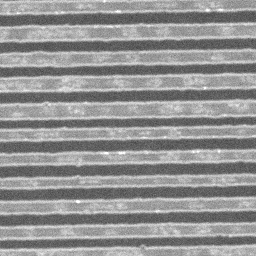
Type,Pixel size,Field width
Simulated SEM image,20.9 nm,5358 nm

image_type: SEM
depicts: parallel lines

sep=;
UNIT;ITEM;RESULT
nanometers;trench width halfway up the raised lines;251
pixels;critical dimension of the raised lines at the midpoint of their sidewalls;13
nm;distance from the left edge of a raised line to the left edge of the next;520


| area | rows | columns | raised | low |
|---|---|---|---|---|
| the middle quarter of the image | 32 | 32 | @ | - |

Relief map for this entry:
-@@@@@@@@@@@@@@@@@@@@@@@@@@@@@@@
@@@@@@@@@@@@@@@@@@@@@@@@@@@@@@@@
@@@@@@@@@@@@@@@@@@@@@@@@@@@@@@@@
--------------------------------
--------------------------------
--------------------------------
--@@@---------@--@@@@@@@@@@@@@@@
@@@@@@@@@@@@@@@@@@@@@@@@@@@@@@@@
@@@@@@@@@@@@@@@@@@@@@@@@@@@@@@@@
@@@@@@@@@@@@@@@@@@@@@@--@@@@@@@@
--------------------------------
--------------------------------
--------------------------------
--@@@-@@@@@@@---@@@@@@@@@@@@@@@@
@@@@@@@@@@@@@@@@@@@@@@@@@@@@@@@@
@@@@@@@@@@@@@@@@@@@@@@@@@@@@@@@@
--------------------------------
--------------------------------
-----------------@@@@---@@------
@@@@@@@@@@@@@@@@@@@@@@@@@@@@@@@@
@@@@@@@@@@@@@@@@@@@@@@@@@@@@@@@@
@@@@@@@@@@@@@@@@@@@@@@@@@@@@@@@@
--------------------------------
--------------------------------
--------------------------------
@@@@@@@@@@@@@@@@@@@@@@@@@@@@@@@@
@@@@@@@@@@@@@@@@@@@@@@@@@@@@@@@@
@@@@@@@@@@@@@@@@@@@@@@@@@@@@@@@@
@@------------------------------
--------------------------------
-----------------@--@@@@@@@-@@--
@@@@@@@@@@@@@@@@@@@@@@@@@@@@@@@@